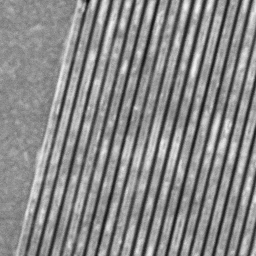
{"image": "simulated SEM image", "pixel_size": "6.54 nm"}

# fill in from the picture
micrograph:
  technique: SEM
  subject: parallel lines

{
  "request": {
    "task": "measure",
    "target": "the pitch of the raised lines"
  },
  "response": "74.5 nanometers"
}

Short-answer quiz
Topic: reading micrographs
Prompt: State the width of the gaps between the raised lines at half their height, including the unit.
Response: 27.8 nm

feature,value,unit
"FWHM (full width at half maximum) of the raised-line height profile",50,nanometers